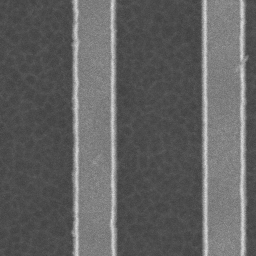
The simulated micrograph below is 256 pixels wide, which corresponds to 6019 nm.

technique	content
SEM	one or a few lines or trenches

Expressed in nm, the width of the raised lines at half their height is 858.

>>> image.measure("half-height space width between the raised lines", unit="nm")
2180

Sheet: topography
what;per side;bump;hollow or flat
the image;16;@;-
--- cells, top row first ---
-----@@------@@-
-----@@------@@-
-----@@------@@-
-----@@------@@-
-----@@------@@-
-----@@------@@-
-----@@------@@-
-----@@------@@-
-----@@------@@-
-----@@------@@-
-----@@------@@-
-----@@------@@-
-----@@------@@-
-----@@------@@-
-----@@------@@-
-----@@------@@-